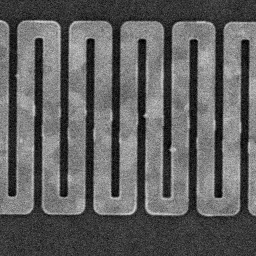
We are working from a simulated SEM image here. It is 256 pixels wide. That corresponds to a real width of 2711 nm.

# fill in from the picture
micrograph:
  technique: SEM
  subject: groups of lines, slits or small figures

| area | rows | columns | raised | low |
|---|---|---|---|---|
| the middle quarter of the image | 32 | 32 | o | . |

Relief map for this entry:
.oooo...oooo..oooo...oooo..oooo.
.oooo...oooo..oooo...oooo..oooo.
.oooo...oooo..oooo...oooo..oooo.
.oooo...oooo..oooo...ooo...oooo.
.oooo...oooo..oooo...ooo...oooo.
.oooo...oooo..oooo...oooo..oooo.
.oooo...oooo..oooo...oooo..oooo.
.oooo...oooo..oooo...oooo..oooo.
.oooo...oooo..oooo...oooo..oooo.
.oooo...oooo..oooo...oooo..oooo.
.oooo...oooo..oooo...oooo..oooo.
.oooo...oooo..oooo...oooo..oooo.
.oooo...oooo..oooo..ooooo..oooo.
.oooo...oooo..oooo..ooooo..oooo.
.oooo...oooo..oooo...oooo..oooo.
.oooo...oooo..oooo...oooo..oooo.
.oooo...oooo..oooo...oooo..oooo.
.oooo...oooo..oooo...oooo..oooo.
.oooo...oooo..oooo...oooo..oooo.
.oooo...oooo..oooo...ooo...oooo.
.oooo...oooo..oooo...ooo...oooo.
.oooo...oooo..oooo...ooo...oooo.
.oooo...oooo..oooo...ooo...oooo.
.oooo...oooo..oooo...ooo...oooo.
.oooo...oooo..oooo...ooo...oooo.
.oooo...oooo..oooo...ooo...oooo.
.oooo...oooo..oooo...ooo...oooo.
.oooo...oooo..oooo...ooo...oooo.
.oooo...oooo..oooo...ooo...oooo.
.oooo...oooo..oooo...ooo...oooo.
.oooo...oooo..oooo...ooo...oooo.
.oooo...oooo..oooo...ooo...oooo.